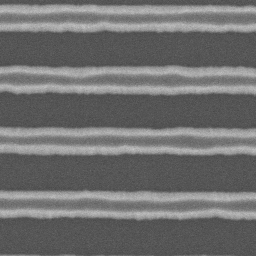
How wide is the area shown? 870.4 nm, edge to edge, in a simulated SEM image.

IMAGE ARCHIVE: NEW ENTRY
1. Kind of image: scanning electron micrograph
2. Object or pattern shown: lines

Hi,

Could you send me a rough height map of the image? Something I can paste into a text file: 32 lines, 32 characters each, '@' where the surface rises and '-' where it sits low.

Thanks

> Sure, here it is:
--------------------------------
@@@@@@@@@@@@@@@@@@@@@@@@@@@@@@@@
@@@@@@@@@@@@@@@@@@@@@@@@@@@@@@@@
@@@@@@@@@@@@@@@@@@@@@@@@@@@@@@@@
--------------------------------
--------------------------------
--------------------------------
--------------------------------
-@@@-----------------@@---------
@@@@@@@@@@@@@@@@@@@@@@@@@@@@@@@@
@@@@@@@@@@@@@@@@@@@@@@@@@@@@@@@@
--------------------@@----------
--------------------------------
--------------------------------
--------------------------------
--------------------------------
@@@@@@@@@@@@@@@@@@@@@@@@@@@@@@@@
@@@@@@@@@@@@@@@@@@@@@@@@@@@@@@@@
@@@@@@@@@@@@@@@@@@@@@@@@@@@@@@@@
--------------------------------
--------------------------------
--------------------------------
--------------------------------
--------------------------------
@@@@@@@@@@@@@@@@@@@@@@@@@@@@@@@@
@@@@@@@@@@@@@@@@@@@@@@@@@@@@@@@@
@@@@@@@@@@@@@@@@@@@@@@@@@@@@@@@@
--------------------------------
--------------------------------
--------------------------------
--------------------------------
--------------------------------